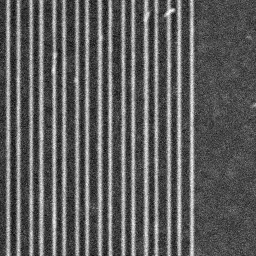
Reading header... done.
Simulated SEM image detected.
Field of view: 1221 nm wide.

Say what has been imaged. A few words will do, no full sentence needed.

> parallel lines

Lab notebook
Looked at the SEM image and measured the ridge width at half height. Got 0.0095 µm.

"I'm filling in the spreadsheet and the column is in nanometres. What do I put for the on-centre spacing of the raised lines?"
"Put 54.9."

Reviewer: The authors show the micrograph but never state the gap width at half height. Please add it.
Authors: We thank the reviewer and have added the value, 43.9 nm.